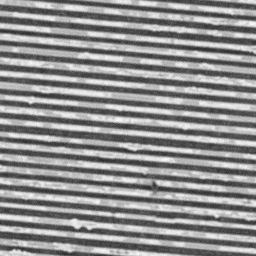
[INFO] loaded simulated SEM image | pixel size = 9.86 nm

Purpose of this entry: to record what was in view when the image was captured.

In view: parallel lines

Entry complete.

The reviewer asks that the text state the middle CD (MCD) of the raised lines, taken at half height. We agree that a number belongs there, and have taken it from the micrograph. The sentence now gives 0.0466 micrometres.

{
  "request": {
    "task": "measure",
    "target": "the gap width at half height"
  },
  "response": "73.6 nm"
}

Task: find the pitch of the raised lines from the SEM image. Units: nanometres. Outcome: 117